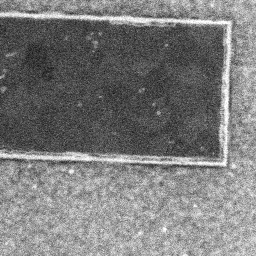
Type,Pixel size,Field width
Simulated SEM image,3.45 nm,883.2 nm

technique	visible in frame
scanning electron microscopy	one or a few lines or trenches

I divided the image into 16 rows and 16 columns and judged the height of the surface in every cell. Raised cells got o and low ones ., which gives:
................
oooooooooooooo..
oooooooooooooo..
oooooooooooooo..
oooooooooooooo..
oooooooooooooo..
oooooooooooooo..
oooooooooooooo..
oooooooooooooo..
oooooooooooooo..
................
................
................
................
................
................